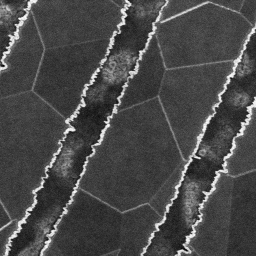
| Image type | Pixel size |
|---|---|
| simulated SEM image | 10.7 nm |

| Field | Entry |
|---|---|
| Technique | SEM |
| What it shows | one or a few lines or trenches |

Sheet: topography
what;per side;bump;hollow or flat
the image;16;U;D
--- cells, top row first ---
DDUUUUUUDDUUUUUU
DUUUUUUUDDUUUUUU
DUUUUUUDDUUUUUUU
UUUUUUUDDUUUUUUD
UUUUUUDDUUUUUUUD
UUUUUUDDUUUUUUDD
UUUUUDDUUUUUUUDD
UUUUUDDUUUUUUDDU
UUUUDDUUUUUUUDDU
UUUUDDUUUUUUDDUU
UUUDDUUUUUUUDDUU
UUUDDUUUUUUDDUUU
UUDDUUUUUUUDDUUU
UUDDUUUUUUDDUUUU
UDDUUUUUUUDDUUUU
UDDUUUUUUDDUUUUU